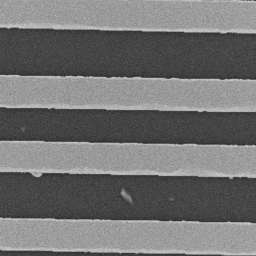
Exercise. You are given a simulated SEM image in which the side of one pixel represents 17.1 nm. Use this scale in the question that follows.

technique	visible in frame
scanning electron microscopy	lines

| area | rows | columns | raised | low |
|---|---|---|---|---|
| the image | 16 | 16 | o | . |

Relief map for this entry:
oooooooooooooooo
oooooooooooooooo
................
................
................
oooooooooooooooo
oooooooooooooooo
................
................
oooooooooooooooo
oooooooooooooooo
................
................
................
oooooooooooooooo
oooooooooooooooo